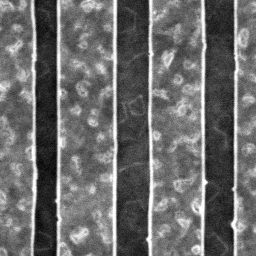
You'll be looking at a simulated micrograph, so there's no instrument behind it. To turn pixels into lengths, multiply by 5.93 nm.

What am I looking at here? one or a few lines or trenches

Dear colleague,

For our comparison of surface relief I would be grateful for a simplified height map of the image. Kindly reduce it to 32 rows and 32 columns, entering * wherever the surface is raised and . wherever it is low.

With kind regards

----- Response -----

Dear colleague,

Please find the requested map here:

****...*******.....******....***
****...*******.....******....***
****...*******.....*******...***
****...*******.....*******...***
****...*******.....*******...***
****...*******.....*******...***
****...*******.....*******...***
****...*******.....*******...***
****...*******.....*******....**
****...*******.....*******...***
****...*******.....*******...***
****...*******.....******....***
****...*******.....******....***
****...*******.....******....***
****...*******.....******....***
****...*******.....******....***
****...*******.....******....***
****...*******.....******....***
****...*******.....******....***
****...*******.....******....***
****...*******.....******....***
****...*******.....******....***
****...*******.....*******...***
****...*******.....******....***
****...*******.....******....***
****...*******.....******....***
****...*******.....******....***
****...*******.....******....***
****...*******.....******....***
****...*******.....******....***
****...*******.....******....***
****...*******.....******....***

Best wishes